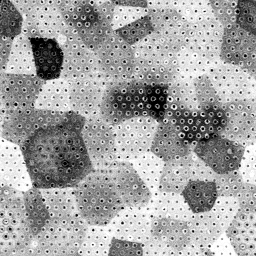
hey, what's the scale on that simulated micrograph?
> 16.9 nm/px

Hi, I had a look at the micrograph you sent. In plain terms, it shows a regular array of holes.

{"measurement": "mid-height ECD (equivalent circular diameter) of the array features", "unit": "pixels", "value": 3.19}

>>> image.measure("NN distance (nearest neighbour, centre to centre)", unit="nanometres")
137